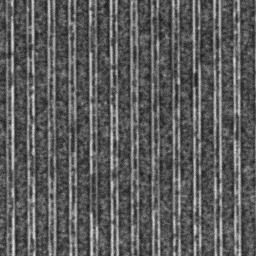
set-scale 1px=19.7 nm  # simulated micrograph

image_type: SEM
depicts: parallel lines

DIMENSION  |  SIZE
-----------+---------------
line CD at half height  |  5.87 pixels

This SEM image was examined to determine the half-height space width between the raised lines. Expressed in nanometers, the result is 291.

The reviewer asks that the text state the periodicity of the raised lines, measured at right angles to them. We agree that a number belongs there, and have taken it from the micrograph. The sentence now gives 407 nm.